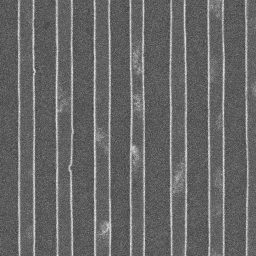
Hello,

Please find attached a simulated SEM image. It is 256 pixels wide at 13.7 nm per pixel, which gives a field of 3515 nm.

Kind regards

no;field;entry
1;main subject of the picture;parallel lines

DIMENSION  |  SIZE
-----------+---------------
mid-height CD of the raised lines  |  208 nm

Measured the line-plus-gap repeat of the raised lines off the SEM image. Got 521 nm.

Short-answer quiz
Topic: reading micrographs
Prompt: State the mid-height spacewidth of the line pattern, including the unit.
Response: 309 nanometres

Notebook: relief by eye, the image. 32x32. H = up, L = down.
LLHHLLLHHLLLHHLLHHLLLHHLLLHHLLLH
LLHHLLLHHLLLHHLLHHLLLHHLLLHHLLLH
LLHHLLLHHLLLHHLLHHLLLHHLLLHHLLLH
LLHHLLLHHLLLHHLLHHLLLHHLLLHHLLLH
LLHHLLLHHLLLHHLLHHLLLHHLLLHHLLLH
LLHHLLLHHLLLHHLLHHLLLHHLLLHHLLLH
LLHHLLLHHLLLHHLLHHLLLHHLLLHHLLLH
LLHHLLLHHLLLHHLLHHLLLHHLLLHHLLLH
LLHHLLLHHLLLHHLLHHLLLHHLLLHHLLLH
LLHHLLLHHLLLHHLLHHLLLHHLLLHHLLLH
LLHHLLLHHLLLHHLLHHLLLHHLLLHHLLLH
LLHHLLLHHLLLHHLLLHLLLHHLLLHHLLLH
LLHHLLLHHLLLHHLLLHLLLHHLLLHHLLLH
LLHHLLLHHLLLHHLLLHLLLHHLLLHHLLLH
LLHHLLLHHLLLHHLLLHLLLHHLLLHHLLLH
LLHHLLLHHLLLHHLLHHLLLHHLLLHHLLLH
LLHHLLLHHLLLHHLLHHLLLHHLLLHHLLLH
LLHHLLLHHLLLHHLLHHLLLHHLLLHHLLLH
LLHHLLLHHLLLHHLLHHLLLHHLLLHHLLLH
LLHHLLLHHLLLHHLLHHLLLHHLLLHHLLLH
LLHHLLLHHLLLHHLLHHLLLHHLLLHHLLLH
LLHHLLLHHLLLHHLLHHLLLHHLLLHHLLLH
LLHHLLLHHLLLHHLLHHLLLHHLLLHHLLLH
LLHHLLLHHLLLHHLLHHLLLHHLLLHHLLLH
LLHHLLLHHLLLHHLLHHLLLHHLLLHHLLLH
LLHHLLLHHLLLHHLLHHLLLHHLLLHHLLLH
LLHHLLLHHLLLHHLLHHLLLHHLLLHHLLLH
LLHHLLLHHLLLHHLLHHLLLHHLLLHHLLLH
LLHHLLLHHLLLHHLLHHLLLHHLLLHHLLLH
LLHHLLLHHLLLHHLLHHLLLLHLLLHHLLLH
LLHHLLLHHLLLHHLLHHLLLLHLLLHHLLLH
LLHHLLLHHLLLHHLLHHLLLLHLLLHHLLLH